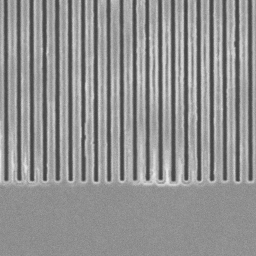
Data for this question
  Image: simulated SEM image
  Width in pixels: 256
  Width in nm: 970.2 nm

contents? parallel lines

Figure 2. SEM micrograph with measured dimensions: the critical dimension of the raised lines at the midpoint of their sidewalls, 33.1 nanometres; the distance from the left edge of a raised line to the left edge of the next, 48.7 nanometres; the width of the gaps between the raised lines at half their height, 0.0166 microns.